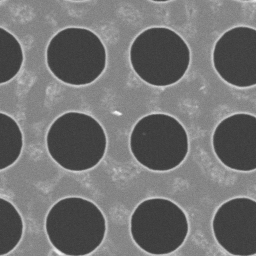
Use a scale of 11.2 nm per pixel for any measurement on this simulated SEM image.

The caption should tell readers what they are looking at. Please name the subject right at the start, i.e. holes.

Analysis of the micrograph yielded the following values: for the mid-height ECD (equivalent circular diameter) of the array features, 650 nm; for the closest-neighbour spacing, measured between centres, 934 nm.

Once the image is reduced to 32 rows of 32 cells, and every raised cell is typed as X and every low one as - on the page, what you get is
XXXXXXXXXXXXXXXXXXXXXXXXXXXXXXXX
XXXXXXXXXXXXXXXXXXXXXXXXXXXXXXXX
XXXXXXXXXXXXXXXXXXXXXXXXXXXXXXXX
XXXXXXXXX-XXXXXXXXX-XXXXXXXXX--X
--XXXXX-----XXXXX-----XXXXXX----
--XXXX-------XXXX------XXXX-----
---XXX-------XXX--------XXX-----
---XXX-------XXX--------XXX-----
---XXX-------XXXX------XXXX-----
--XXXXX-----XXXXX------XXXXX----
XXXXXXXXX--XXXXXXXX--XXXXXXXX---
XXXXXXXXXXXXXXXXXXXXXXXXXXXXXXXX
XXXXXXXXXXXXXXXXXXXXXXXXXXXXXXXX
XXXXXXXXXXXXXXXXXXXXXXXXXXXXXXXX
-XXXXXXX---XXXXXXX---XXXXXXXX---
--XXXXX-----XXXXX------XXXX-----
---XXX-------XXXX------XXXX-----
---XXX-------XXX-------XXXX-----
---XXX-------XXX--------XXX-----
--XXXX-------XXXX------XXXX-----
-XXXXXX-----XXXXXX----XXXXXX----
XXXXXXXXXXXXXXXXXXXXXXXXXXXXXXXX
XXXXXXXXXXXXXXXXXXXXXXXXXXXXXXXX
XXXXXXXXXXXXXXXXXXXXXXXXXXXXXXXX
XXXXXXXXXXXXXXXXXXXXXXXXXXXXXXXX
-XXXXXX-----XXXXXX----XXXXXX----
--XXXX-------XXXX------XXXX-----
---XXX-------XXX-------XXXX-----
---XXX-------XXX-------XXXX-----
---XXX-------XXXX------XXXX-----
--XXXXX-----XXXXX------XXXX-----
-XXXXXXX---XXXXXXX---XXXXXXXX---